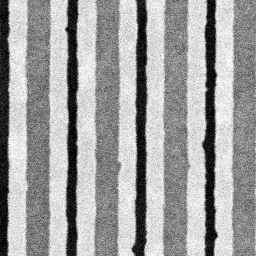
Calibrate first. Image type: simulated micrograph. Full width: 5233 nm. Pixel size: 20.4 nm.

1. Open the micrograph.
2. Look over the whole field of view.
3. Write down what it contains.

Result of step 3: parallel lines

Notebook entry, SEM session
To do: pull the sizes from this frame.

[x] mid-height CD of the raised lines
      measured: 0.358 µm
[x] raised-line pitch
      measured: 0.704 micrometres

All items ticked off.